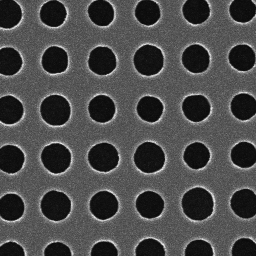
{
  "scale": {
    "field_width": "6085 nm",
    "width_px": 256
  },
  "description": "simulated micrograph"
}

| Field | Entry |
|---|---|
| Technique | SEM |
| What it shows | a regular array of holes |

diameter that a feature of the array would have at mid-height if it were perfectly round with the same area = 685 nm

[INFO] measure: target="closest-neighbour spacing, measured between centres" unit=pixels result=46.4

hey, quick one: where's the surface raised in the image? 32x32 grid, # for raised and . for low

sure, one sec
..####..###...###...###...###...
...##...###...###...###...###...
...##...###...###...###...###..#
.###############################
################################
################################
..####..###...###...###...###...
...##....##....##....##...###...
...##...###...###...###...###..#
################################
################################
################################
..###...###...####..###...###...
...##....##...###...###...###...
...##....##...###...###...###...
######..########################
################################
################################
..####..###...###...###...###...
...##....##....##....##...###...
...##....##....##...###...###...
#.####..##########.#############
################################
########################.#######
..###...####..###...###...###...
...##....##....##....##....##...
...##....##....##...###....##...
#.####..################.#######
################################
################################
..####..####..###...####..###...
...###...##....##....##....##...